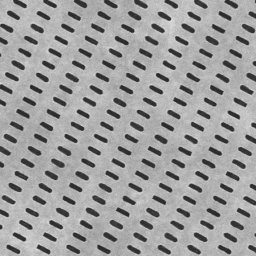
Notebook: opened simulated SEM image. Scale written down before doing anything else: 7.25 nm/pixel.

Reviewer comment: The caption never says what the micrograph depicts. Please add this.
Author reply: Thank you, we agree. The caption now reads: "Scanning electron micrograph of a regular array of holes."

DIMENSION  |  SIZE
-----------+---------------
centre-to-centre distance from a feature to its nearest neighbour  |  99.7 nanometers